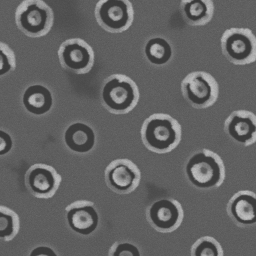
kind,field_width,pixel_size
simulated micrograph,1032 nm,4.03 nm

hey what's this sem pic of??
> a regular array of ring-shaped grooves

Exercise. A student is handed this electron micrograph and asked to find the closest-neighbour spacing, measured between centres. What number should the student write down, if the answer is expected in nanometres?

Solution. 230